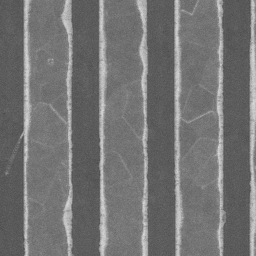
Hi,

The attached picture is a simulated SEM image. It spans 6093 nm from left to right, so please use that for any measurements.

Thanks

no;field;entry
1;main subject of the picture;lines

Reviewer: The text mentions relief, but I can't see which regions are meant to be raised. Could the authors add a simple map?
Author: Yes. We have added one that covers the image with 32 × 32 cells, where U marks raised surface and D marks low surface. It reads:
DDDUUUUUUDDDUUUUUUDDDDUUUUUUDDDU
DDDUUUUUDDDDDUUUUUDDDDUUUUUUDDDU
DDDUUUUUDDDDDUUUUUDDDDUUUUUUDDDU
DDDUUUUUUDDDUUUUUUDDDDUUUUUUDDDU
DDDUUUUUUDDDDUUUUUDDDDUUUUUUDDDU
DDDUUUUUUDDDDUUUUUDDDDUUUUUUDDDU
DDDUUUUUUDDDDUUUUUDDDDUUUUUUDDDU
DDDUUUUUUDDDDUUUUUDDDDUUUUUUDDDU
DDDUUUUUUDDDDUUUUUDDDDUUUUUUDDDU
DDDUUUUUUDDDDUUUUUDDDDUUUUUUDDDU
DDDUUUUUUDDDDUUUUUDDDDUUUUUUDDDD
DDDUUUUUUDDDDUUUUUDDDDUUUUUUDDDU
DDDUUUUUUDDDDUUUUUDDDDUUUUUUDDDU
DDDUUUUUUDDDDUUUUUDDDDUUUUUUDDDU
DDDUUUUUUDDDDUUUUUDDDDUUUUUUDDDU
DDDUUUUUUDDDDUUUUUDDDDUUUUUUDDDU
DDDUUUUUUDDDDUUUUUDDDDUUUUUUDDDU
DDDUUUUUUDDDDUUUUUDDDDUUUUUUDDDU
DDDUUUUUUDDDDUUUUUDDDDUUUUUUDDDU
DDDUUUUUUDDDDUUUUUDDDDUUUUUUDDDU
DDDUUUUUUDDDDUUUUUDDDDUUUUUUDDDU
DDDUUUUUUDDDDUUUUUDDDDUUUUUUDDDU
DDDUUUUUUDDDDUUUUUDDDDUUUUUUDDDU
DDDUUUUUUDDDDUUUUUDDDDUUUUUUDDDU
DDDUUUUUUDDDDUUUUUDDDDUUUUUUDDDU
DDDUUUUUUDDDDUUUUUDDDDUUUUUUDDDU
DDDUUUUUDDDDDUUUUUDDDDUUUUUUDDDU
DDDUUUUUDDDDDUUUUUDDDDUUUUUUDDDU
DDDUUUUUUDDDDUUUUUDDDDUUUUUUDDDU
DDDUUUUUUDDDDUUUUUDDDDUUUUUUDDDU
DDDUUUUUUDDDDUUUUUDDDDUUUUUUDDDU
DDDUUUUUUDDDDUUUUUDDDDUUUUUUDDDU